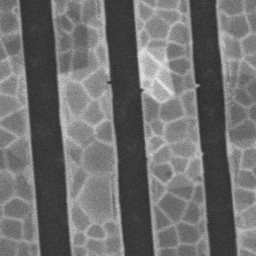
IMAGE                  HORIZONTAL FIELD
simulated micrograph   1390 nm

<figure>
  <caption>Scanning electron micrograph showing one or a few lines or trenches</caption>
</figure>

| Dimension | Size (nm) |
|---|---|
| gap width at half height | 177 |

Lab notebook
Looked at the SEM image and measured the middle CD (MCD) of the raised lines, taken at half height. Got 271 nanometers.